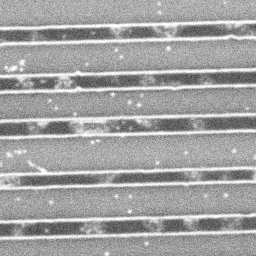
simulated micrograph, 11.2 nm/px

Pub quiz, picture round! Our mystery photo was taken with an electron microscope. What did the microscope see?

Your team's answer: parallel lines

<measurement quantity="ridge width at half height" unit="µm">0.177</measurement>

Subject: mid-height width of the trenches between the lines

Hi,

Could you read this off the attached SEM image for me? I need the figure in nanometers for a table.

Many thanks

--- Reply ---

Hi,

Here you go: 362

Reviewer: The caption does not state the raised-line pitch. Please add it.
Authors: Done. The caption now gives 545 nanometres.